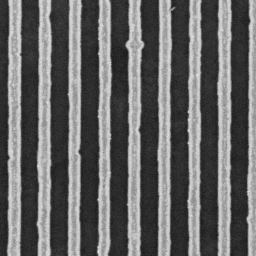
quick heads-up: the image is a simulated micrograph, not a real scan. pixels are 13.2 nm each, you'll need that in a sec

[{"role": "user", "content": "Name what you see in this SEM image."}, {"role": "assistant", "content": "parallel lines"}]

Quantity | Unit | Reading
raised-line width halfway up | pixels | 8.62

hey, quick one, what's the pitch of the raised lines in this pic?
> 397 nm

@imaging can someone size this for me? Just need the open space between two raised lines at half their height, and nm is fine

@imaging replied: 286